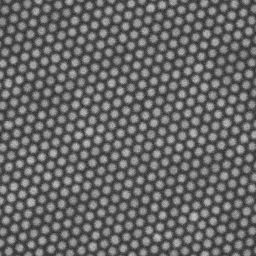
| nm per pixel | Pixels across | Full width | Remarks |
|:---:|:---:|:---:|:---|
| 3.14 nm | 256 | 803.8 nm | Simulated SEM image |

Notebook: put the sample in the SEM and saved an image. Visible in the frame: a regular array of raised bodies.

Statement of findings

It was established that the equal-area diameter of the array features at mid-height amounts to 22.4 nm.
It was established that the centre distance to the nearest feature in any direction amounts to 0.0355 micrometres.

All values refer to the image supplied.